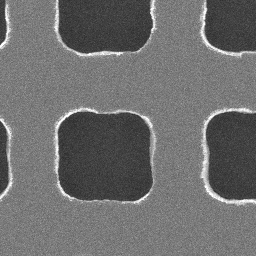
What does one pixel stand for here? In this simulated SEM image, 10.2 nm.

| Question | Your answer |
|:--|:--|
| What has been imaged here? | holes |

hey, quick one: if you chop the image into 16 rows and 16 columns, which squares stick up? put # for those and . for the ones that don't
####.....####...
####......###...
####.....####...
################
################
################
################
####.....####...
####.....####...
.###.....####...
.###.....####...
####.....####...
#####....#####.#
################
################
################